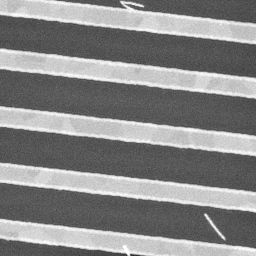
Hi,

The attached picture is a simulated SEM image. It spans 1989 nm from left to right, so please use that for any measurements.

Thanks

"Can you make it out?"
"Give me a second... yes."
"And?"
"lines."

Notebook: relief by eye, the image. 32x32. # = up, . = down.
##########......................
###################.............
......#####################.....
...............#################
.......................#########
................................
####............................
############....................
#####################...........
.......######################...
.................###############
..........................######
................................
##..............................
##########......................
###################.............
.......####################.....
...............#################
.........................#######
................................
#...............................
#########.......................
###################.............
.......####################.....
...............#################
........................########
................................
#...............................
##########......................
##################..............
......#####################.....
..............##################